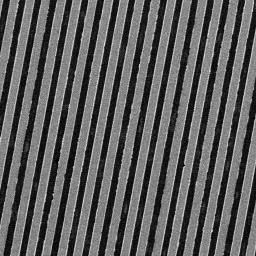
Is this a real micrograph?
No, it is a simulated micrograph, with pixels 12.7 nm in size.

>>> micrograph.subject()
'parallel lines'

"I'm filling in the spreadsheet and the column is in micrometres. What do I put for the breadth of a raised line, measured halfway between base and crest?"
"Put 0.108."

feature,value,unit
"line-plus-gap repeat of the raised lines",196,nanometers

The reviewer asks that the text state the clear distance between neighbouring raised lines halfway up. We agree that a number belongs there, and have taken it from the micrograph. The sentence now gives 87.3 nm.